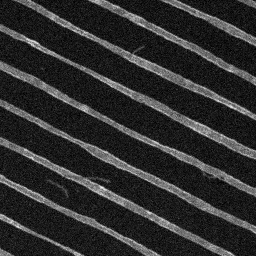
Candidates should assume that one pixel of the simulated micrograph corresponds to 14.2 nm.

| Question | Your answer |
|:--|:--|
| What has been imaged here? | parallel lines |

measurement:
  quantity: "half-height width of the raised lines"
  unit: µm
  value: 0.0923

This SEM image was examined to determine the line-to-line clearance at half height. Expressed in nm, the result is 396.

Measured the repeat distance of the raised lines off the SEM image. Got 0.479 microns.